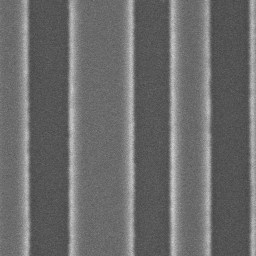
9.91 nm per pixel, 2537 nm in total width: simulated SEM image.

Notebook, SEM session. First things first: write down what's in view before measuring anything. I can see lines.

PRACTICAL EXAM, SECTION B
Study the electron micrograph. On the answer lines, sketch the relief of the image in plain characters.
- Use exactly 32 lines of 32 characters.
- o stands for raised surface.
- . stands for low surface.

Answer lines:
ooo......oooooooo.....oooo.....o
ooo......oooooooo.....oooo.....o
ooo......oooooooo....ooooo.....o
ooo......oooooooo.....oooo.....o
ooo......oooooooo.....oooo.....o
ooo......oooooooo.....oooo.....o
ooo......oooooooo.....oooo.....o
ooo......oooooooo.....oooo.....o
ooo......oooooooo.....oooo.....o
ooo......oooooooo.....oooo.....o
ooo......oooooooo.....oooo.....o
ooo......oooooooo.....oooo......
ooo......oooooooo.....oooo.....o
ooo......oooooooo.....oooo.....o
ooo......oooooooo.....oooo.....o
ooo......oooooooo.....oooo......
ooo......oooooooo.....oooo.....o
ooo......oooooooo.....oooo.....o
ooo......oooooooo.....oooo.....o
ooo......oooooooo.....oooo.....o
ooo......oooooooo.....oooo......
ooo......oooooooo.....oooo......
ooo......oooooooo.....oooo.....o
ooo......oooooooo.....oooo......
ooo......oooooooo.....oooo......
ooo......oooooooo.....oooo......
ooo......oooooooo.....oooo......
ooo......oooooooo.....oooo......
oooo.....oooooooo.....oooo......
oooo.....oooooooo.....oooo......
ooo......oooooooo.....oooo......
ooo......oooooooo.....oooo......